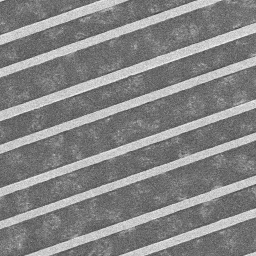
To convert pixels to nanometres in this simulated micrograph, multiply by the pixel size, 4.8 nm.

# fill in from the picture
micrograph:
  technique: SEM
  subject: parallel lines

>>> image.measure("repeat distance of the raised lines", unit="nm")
171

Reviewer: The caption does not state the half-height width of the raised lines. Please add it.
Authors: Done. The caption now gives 39.1 nm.